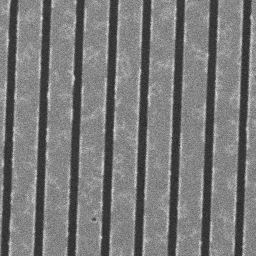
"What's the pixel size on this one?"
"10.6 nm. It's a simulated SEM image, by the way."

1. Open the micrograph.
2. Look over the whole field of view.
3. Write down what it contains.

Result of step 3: parallel lines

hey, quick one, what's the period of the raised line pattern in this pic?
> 355 nanometres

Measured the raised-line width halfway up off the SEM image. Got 0.254 um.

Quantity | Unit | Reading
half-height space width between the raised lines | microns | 0.0984